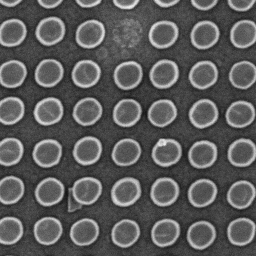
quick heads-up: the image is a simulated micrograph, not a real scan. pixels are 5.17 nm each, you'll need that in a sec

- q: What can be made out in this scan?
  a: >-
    a regular array of raised bodies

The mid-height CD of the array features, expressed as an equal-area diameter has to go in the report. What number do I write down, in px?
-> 26.9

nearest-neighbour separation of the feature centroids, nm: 192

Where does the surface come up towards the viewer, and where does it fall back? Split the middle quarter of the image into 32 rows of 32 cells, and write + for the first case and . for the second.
...+++++......+++++....+++++....
..+++++++....++++++...++++++....
..+++++++....++++++...++++++...+
..+++++++....++++++...++++++...+
...+++++.....++++++...+++++.....
....++........++++.....+++......
................................
................................
................................
....++++......++++.....++++.....
...++++++....++++++...+++++.....
...++++++....++++++..+++++++....
...++++++...+++++++..+++++++....
...+++++.....++++++..+++++++....
....++++.....+++++....+++++.....
.......................++.......
................................
................................
.....++.........................
....+++++.....++++......++++....
...++++++....++++++....++++++...
...++++++....++++++...+++++++...
...++++++...+++++++...+++++++..+
...++++++...+++++++...+++++++..+
....+++......+++++.....+++++....
................................
................................
................................
................................
...++++++.....++++.....+++++....
...++++++....++++++...++++++....
..+++++++...+++++++...++++++...+